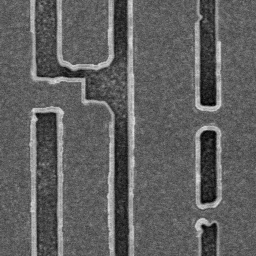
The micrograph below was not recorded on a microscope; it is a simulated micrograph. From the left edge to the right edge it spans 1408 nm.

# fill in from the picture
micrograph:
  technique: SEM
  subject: one or a few lines or trenches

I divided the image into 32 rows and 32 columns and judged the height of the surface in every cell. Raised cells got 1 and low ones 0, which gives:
11110001111111001111111110011111
11110001111111001111111110011111
11110001111111001111111110011111
11110001111111001111111110011111
11110001111111001111111110011111
11110001111111001111111110011111
11110001111111001111111110011111
11110001111111001111111110011111
11110000011110001111111110011111
11110000000000001111111110011111
11111111111000001111111110011111
11111111111000001111111110011111
11111111111000001111111110011111
11111111111111001111111111111111
11110001111111001111111111111111
11110001111111001111111111111111
11110001111111001111111110011111
11110001111111001111111110011111
11110001111111001111111110011111
11110001111111001111111110011111
11110001111111001111111110011111
11110001111111001111111110011111
11110001111111001111111110011111
11110001111111001111111110011111
11110001111111001111111110011111
11110001111111001111111110111111
11110001111111001111111111111111
11110001111111001111111111111111
11110001111111001111111110011111
11110001111111001111111110011111
11110001111111001111111110011111
11110001111111001111111110011111